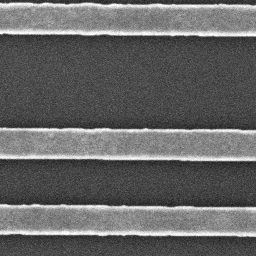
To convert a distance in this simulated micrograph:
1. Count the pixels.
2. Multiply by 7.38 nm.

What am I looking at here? lines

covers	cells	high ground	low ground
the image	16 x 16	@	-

@@@@@@@@@@@@@@@@
@@@@@@@@@@@@@@@@
----------------
----------------
----------------
----------------
----------------
----------------
@@@@@@@@@@@@@@@@
@@@@@@@@@@@@@@@@
----------------
----------------
----------------
@@@@@@@@@@@@@@@@
@@@@@@@@@@@@@@@@
----------------